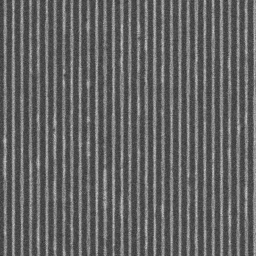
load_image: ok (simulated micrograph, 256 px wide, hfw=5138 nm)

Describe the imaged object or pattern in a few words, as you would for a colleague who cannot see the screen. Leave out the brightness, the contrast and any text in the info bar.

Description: parallel lines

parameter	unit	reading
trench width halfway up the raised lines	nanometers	138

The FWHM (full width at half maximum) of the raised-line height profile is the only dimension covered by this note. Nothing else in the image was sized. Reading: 40.1 nm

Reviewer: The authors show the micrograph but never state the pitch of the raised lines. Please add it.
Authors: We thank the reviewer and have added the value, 167 nm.